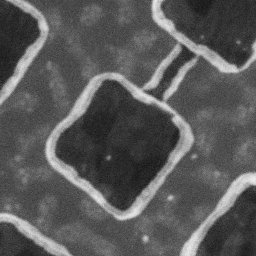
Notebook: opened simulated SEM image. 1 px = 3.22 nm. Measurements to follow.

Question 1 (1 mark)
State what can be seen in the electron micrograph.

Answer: raised bodies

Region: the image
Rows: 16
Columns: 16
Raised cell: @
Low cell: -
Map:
@@--------@@@@@@
@@@-------@@@@@@
@@@--------@@@@@
@@----------@@@@
@-------------@-
@-----@@@-------
-----@@@@@------
----@@@@@@@-----
---@@@@@@@@@----
---@@@@@@@@@----
----@@@@@@@-----
-----@@@@@-----@
------@@@-----@@
@------@-----@@@
@@----------@@@@
@@@@--------@@@@